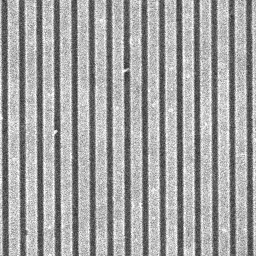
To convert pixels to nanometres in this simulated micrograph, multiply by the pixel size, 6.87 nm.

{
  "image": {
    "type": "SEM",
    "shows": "parallel lines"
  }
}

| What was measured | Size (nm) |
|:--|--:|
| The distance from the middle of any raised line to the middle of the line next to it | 120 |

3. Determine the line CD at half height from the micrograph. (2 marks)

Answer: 78.1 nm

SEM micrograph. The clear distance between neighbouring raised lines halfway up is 42.1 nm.